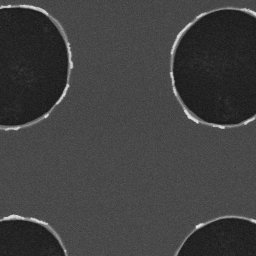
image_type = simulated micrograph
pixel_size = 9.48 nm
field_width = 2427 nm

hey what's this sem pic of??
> holes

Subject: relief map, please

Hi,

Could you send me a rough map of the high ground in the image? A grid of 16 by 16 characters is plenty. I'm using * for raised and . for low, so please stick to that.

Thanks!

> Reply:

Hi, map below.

****************
....********....
....*******.....
....*******.....
....*******.....
....*******.....
...********.....
..***********..*
****************
****************
****************
****************
****************
****************
...*********....
....*******.....